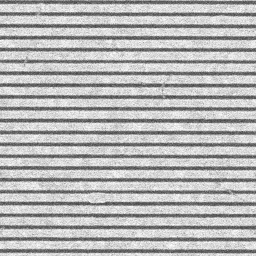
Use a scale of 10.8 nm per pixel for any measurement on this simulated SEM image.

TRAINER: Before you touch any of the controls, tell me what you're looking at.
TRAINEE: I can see parallel lines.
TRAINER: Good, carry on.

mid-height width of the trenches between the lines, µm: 0.0488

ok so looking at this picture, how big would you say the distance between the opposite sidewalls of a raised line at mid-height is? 0.0787 µm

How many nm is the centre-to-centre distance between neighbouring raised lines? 128